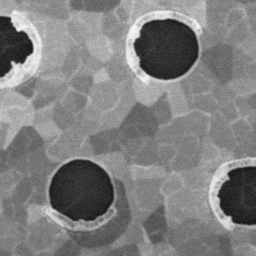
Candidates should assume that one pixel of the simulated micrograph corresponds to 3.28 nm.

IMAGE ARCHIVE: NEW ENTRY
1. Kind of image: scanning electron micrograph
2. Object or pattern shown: holes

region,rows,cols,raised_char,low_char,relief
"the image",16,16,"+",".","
++++++++++++++++
.++++++++...++++
..+++++++...++++
..+++++++...++++
+++++++++...++++
++++++++++++++++
++++++++++++++++
++++++++++++++++
++++++++++++++++
++++++++++++++++
++++..+++++++++.
+++....+++++++..
+++....+++++++..
++++..++++++++..
++++++++++++++++
++++++++++++++++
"